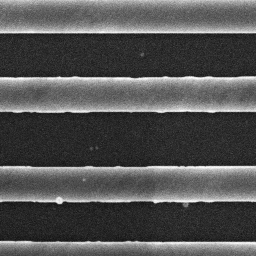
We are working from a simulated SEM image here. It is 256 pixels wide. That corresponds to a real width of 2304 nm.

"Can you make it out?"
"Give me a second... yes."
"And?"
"lines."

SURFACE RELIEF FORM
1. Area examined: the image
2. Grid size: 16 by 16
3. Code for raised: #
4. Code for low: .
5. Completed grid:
################
################
................
................
................
################
################
................
................
................
################
################
################
................
................
################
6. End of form